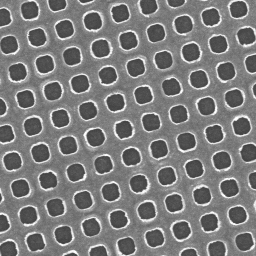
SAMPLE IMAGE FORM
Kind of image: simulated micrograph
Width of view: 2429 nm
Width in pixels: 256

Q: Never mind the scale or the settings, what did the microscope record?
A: a regular array of holes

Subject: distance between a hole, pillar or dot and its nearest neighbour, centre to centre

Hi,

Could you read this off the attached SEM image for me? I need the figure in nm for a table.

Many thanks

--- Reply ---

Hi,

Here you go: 266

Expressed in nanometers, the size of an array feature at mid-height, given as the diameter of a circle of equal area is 173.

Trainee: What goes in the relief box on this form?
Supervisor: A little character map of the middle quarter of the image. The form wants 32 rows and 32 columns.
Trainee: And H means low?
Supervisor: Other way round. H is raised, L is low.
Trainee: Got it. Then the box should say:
HHHHHHHHHHHHHHHHLLLLHHHLLLLHHHHH
HHHHHHHHHLLLLHHHLLLLHHHHHHHHHHHH
HHHHHHHHHLLLLHHHLLLLHHHHHHHHHHHH
HHLLLLHHHLLLLHHHHHHHHHHHHHHHHHHL
HHLLLLHHHLLLHHHHHHHHHHHHHLLLLHHH
HHLLLLHHHHHHHHHHHHHHHHHHHLLLLHHH
HHLLLLHHHHHHHHHHHHLLLLHHHLLLLHHH
HHHHHHHHHHHHHLHHHHLLLLHHHLLLLHHH
HHHHHHHHHHHLLLLHHHLLLLHHHHHHHHHH
HHHHHHLHHHHLLLLHHHLLLLHHHHHHHHHH
HHHHLLLLHHHLLLLHHHHHHHHHHHHHLLHH
HHHHLLLLHHHHLLHHHHHHHHHHHHHLLLLH
LHHHLLLLHHHHHHHHHHHHHLHHHHHLLLLH
LHHHHLLHHHHHHHHHHHHHLLLLHHHLLLLH
LHHHHHHHHHHHHHLLHHHHLLLLHHHLLLHH
HHHHHHHHHHHHHLLLLHHHLLLLHHHHHHHH
HHHHHHHLLHHHHLLLLHHHLLLHHHHHHHHH
HHHHHHLLLLHHHLLLLHHHHHHHHHHHHLLL
LLHHHHLLLLHHHHLHHHHHHHHHHHHHLLLL
LLLHHHLLLLHHHHHHHHHHHHLLLHHHLLLL
LLLHHHHLLHHHHHHHHHHHHHLLLLHHHLLL
LLLHHHHHHHHHHHHLLLHHHHLLLLHHHLLH
LHHHHHHHHHHHHHHLLLLHHHLLLLHHHHHH
HHHHHHHHLLLLHHHLLLLHHHHLHHHHHHHH
HHHHHHHHLLLLHHHLLLLHHHHHHHHHHHHL
HLLLLHHHLLLLHHHHHHHHHHHHHHHHHHLL
HLLLLHHHLLLLHHHHHHHHHHHHLLLHHHLL
HLLLLHHHHLHHHHHHHHHHHHHLLLLLHHHL
HLLLLHHHHHHHHHHHHLLLHHHHLLLLHHHH
HHHHHHHHHHHHHHHHLLLLLHHHLLLLHHHH
HHHHHHHHHHLLLHHHHLLLLHHHHHHHHHHH
HHHHHHHHHLLLLLHHHLLLHHHHHHHHHHHH